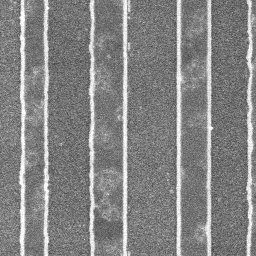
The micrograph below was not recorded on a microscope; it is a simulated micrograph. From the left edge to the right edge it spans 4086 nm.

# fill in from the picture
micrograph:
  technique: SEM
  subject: one or a few lines or trenches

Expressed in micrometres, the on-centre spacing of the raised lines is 1.27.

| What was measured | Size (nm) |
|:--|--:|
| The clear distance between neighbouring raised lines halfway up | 724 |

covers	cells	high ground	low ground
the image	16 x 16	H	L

LHHLLLHHLLLHHLLL
LHHLLLHHLLLHHLLL
LHHLLLHHLLLHHLLL
LHHLLLHHLLLHHLLL
LHHLLLHHLLLHHLLL
LHHLLLHHLLLHHLLL
LHHLLLHHLLLHHLLL
LHHLLLHHLLLHHLLL
LHHLLLHHLLLHHLLL
LHHLLLHHLLLHHLLL
LHHLLLHHLLLHHLLL
LHHLLLHHLLLHHLLL
LHHLLLHHLLLHHLLL
LHHLLLHHLLLHHLLL
LHHLLLHHLLLHHLLL
LHHLLLHHLLLHHLLH